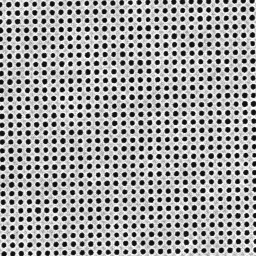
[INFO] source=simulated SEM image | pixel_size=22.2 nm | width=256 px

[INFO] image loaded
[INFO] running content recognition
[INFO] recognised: a regular array of holes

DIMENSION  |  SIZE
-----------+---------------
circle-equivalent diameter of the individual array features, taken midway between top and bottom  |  128 nm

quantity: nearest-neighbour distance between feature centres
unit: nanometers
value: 186